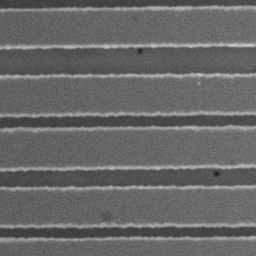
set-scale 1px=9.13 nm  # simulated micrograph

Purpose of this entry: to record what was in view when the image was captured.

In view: lines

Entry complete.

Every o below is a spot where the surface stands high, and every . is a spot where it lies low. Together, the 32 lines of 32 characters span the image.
................................
oooooooooooooooooooooooooooooooo
oooooooooooooooooooooooooooooooo
oooooooooooooooooooooooooooooooo
oooooooooooooooooooooooooooooooo
oooooooooooooooooooooooooooooooo
................................
................................
................................
o..o..oooooooooooooooooooooooooo
oooooooooooooooooooooooooooooooo
oooooooooooooooooooooooooooooooo
oooooooooooooooooooooooooooooooo
oooooooooooooooooooooooooooooooo
oooooo.o........................
................................
oooooooooooooooooooooooooooooooo
oooooooooooooooooooooooooooooooo
oooooooooooooooooooooooooooooooo
oooooooooooooooooooooooooooooooo
oooooooooooooooooooooooooooooooo
................................
................................
..o..o..o..ooooooooooooooooooooo
oooooooooooooooooooooooooooooooo
oooooooooooooooooooooooooooooooo
oooooooooooooooooooooooooooooooo
oooooooooooooooooooooooooooooooo
................................
................................
oooooooooooooooooooooooooooooooo
oooooooooooooooooooooooooooooooo